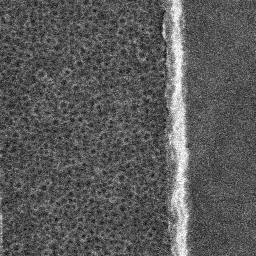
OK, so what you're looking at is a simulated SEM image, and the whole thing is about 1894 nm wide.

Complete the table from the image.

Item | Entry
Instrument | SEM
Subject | one or a few lines or trenches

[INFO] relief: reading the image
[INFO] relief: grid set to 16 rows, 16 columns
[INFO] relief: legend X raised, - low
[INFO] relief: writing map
-----------XXXXX
-----------XXXXX
-----------XXXXX
-----------XXXXX
-----------XXXXX
-----------XXXXX
-----------XXXXX
-----------XXXXX
-----------XXXXX
-----------XXXXX
-----------XXXXX
-----------XXXXX
-----------XXXXX
-----------XXXXX
-----------XXXXX
-----------XXXXX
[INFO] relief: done